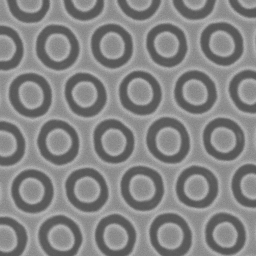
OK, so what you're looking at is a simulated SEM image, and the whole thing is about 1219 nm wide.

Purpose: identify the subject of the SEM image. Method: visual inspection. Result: a regular array of ring-shaped grooves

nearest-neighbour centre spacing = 259 nanometres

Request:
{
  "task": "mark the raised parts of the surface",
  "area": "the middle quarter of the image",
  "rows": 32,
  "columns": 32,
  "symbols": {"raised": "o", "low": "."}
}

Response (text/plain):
..oooooooo.....oooooooooo...oooo
oooooooooooooooooooooooooooooooo
ooo....ooooooooo......oooooooo..
o.......ooooooo........oooooo...
o....o...ooooo...oooo..ooooo...o
...ooooo..oooo..oooooo..oooo..oo
..oooooo..oooo..oooooo..oooo..oo
..oooooo...ooo..oooooo..oooo..oo
..oooooo...ooo..oooooo..oooo..oo
o..ooooo...ooo...ooooo..oooo...o
o...ooo...ooooo.........ooooo...
oo.......ooooooo.......ooooooo..
ooo.....ooooooooo....ooooooooooo
oooooooooooooooooooooooo....oooo
.oooooooo.....oooooooo.......ooo
..oooooo.......ooooooo........oo
...oooo....ooo...oooo...oooo...o
o..oooo...ooooo..oooo..oooooo..o
oo..ooo..oooooo...oo...oooooo..o
oo..ooo..oooooo...oo...oooooo...
oo..ooo...ooooo...ooo..oooooo...
o...oooo..ooooo..oooo...ooooo..o
...ooooo...ooo...ooooo...ooo...o
...oooooo.......ooooooo.......oo
..oooooooo.....oooooooooo....ooo
oooooooooooooooooo.ooooooooooooo
ooo.....oooooooo.......ooooooo..
oo.......oooooo.........ooooo...
o....oo...ooooo..ooooo..oooo...o
...ooooo..oooo...ooooo...ooo..oo
...oooooo..ooo...oooooo..ooo..oo
...oooooo..ooo...oooooo..ooo..oo